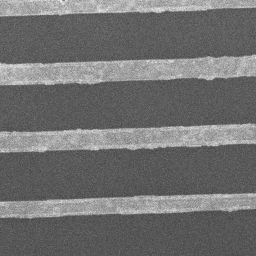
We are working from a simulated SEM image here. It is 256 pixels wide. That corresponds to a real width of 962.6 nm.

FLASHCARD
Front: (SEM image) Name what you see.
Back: one or a few lines or trenches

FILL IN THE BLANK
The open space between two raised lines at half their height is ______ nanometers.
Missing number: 184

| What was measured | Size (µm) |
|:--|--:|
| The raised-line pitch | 0.253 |